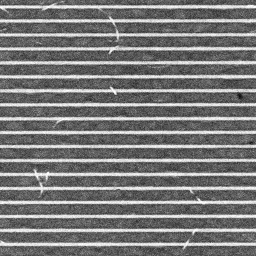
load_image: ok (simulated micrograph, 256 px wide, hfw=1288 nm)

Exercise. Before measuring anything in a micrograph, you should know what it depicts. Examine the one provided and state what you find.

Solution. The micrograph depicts parallel lines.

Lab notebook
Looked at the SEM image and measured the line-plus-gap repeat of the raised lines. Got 0.0703 microns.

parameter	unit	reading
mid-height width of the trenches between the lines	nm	57.2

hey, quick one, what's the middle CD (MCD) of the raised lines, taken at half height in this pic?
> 13.2 nanometers